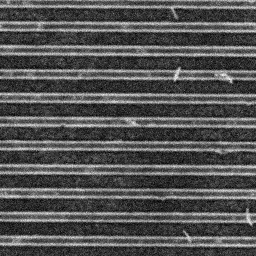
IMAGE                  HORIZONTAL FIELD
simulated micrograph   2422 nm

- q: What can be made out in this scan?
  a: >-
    parallel lines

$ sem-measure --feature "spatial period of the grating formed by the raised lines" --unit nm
225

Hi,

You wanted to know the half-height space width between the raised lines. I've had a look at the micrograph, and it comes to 147 nanometres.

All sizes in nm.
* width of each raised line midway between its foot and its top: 73.3